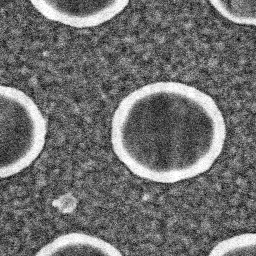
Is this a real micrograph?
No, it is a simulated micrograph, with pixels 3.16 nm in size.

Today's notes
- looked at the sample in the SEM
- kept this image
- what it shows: raised bodies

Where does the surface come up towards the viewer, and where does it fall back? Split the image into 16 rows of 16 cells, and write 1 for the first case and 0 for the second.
0001111000000011
0000000000000000
0000000000000000
0000000000000000
0000000000000000
0000000000100000
1100000011111000
1100000111111100
1110000111111100
1100000111111000
1000000011111000
0000000000000000
0000000000000000
0000000000000000
0000000000000000
0001111000000011